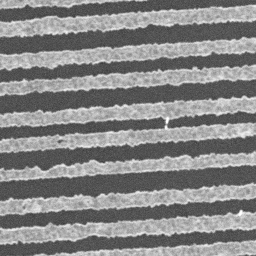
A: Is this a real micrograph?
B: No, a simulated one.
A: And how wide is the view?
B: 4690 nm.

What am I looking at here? parallel lines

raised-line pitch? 541 nm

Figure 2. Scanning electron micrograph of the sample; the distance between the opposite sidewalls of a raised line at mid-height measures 224 nm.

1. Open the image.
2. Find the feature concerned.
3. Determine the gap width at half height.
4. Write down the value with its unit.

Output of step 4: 302 nm